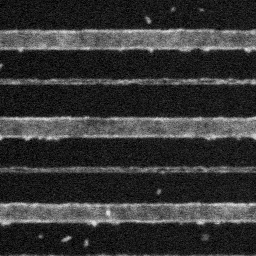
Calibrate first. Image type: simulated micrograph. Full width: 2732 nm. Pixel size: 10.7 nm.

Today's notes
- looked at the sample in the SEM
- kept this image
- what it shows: lines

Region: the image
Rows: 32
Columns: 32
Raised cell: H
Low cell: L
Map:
LLLLLLLLLLLLLLLLLLLLLLLLLLLLLLLL
LLLLLLLLLLLLLLLLLLLLLLLLLLLLLLLL
LLLLLLLLLLLLLLLLLLLLLLLLLLLLLLLL
LLLLLLLLLLLLLLLLLLLLLLLLLLLLLLLL
HHHHHHHHHHHHHHHHHHHHHHHHHHHHHHHH
HHHHHHHHHHHHHHHHHHHHHHHHHHHHHHHH
LLLLLLLLLLLLLLLLLLLLLLLLLLLLLLLL
LLLLLLLLLLLLLLLLLLLLLLLLLLLLLLLL
LLLLLLLLLLLLLLLLLLLLLLLLLLLLLLLL
LLLLLLLLLLLLLLLLLLLLLLLLLLLLLLLL
LLLLLLLLLLLLLLLLLLLLLLLLLLLLLLLL
LLLLLLLLLLLLLLLLLLLLLLLLLLLLLLLL
LLLLLLLLLLLLLLLLLLLLLLLLLLLLLLLL
LLLLLLLLLLLLLLLLLLLLLLLLLLLLLLLL
LLLLLLLLLLLLLLLLLLLLLLLLLLLLLLLL
HHHHHHHHHHHHHHHHHHHHHHHHHHHHHHHH
HHHHHHHHHHHHHHHHHHHHHHHHHHHHHHHH
LLLLLLLLLLLLLLLLLLLLLLLLLLLLLLLL
LLLLLLLLLLLLLLLLLLLLLLLLLLLLLLLL
LLLLLLLLLLLLLLLLLLLLLLLLLLLLLLLL
LLLLLLLLLLLLLLLLLLLLLLLLLLLLLLLL
LLLLLLLLLLLLLLLLLLLLHLLLLLLLLLLL
LLLLLLLLLLLLLLLLLLLLLLLLLLLLLLLL
LLLLLLLLLLLLLLLLLLLLLLLLLLLLLLLL
LLLLLLLLLLLLLLLLLLLLLLLLLLLLLLLL
LLHLLLLLLLLLLLLLLLLLLLLHHLLLLLLL
HHHHHHHHHHHHHHHHHHHHHHHHHHHHHHHH
HHHHHHHHHHHHHHHHHHHHHHHHHHHHHHHH
LLLLLLLLLLLLLLLLLLLLLLLLLLLLLLLL
LLLLLLLLLLLLLLLLLLLLLLLLLLLLLLLL
LLLLLLLLLLLLLLLLLLLLLLLLLLLLLLLL
LLLLLLLLLLLLLLLLLLLLLLLLLLLLLLLL